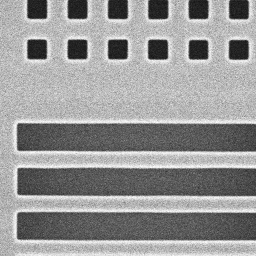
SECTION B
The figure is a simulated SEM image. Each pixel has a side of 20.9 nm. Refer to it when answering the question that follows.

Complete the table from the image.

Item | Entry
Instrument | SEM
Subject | groups of lines, slits or small figures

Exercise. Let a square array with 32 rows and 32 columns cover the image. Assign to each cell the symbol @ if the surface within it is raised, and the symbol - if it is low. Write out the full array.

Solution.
@@@---@@---@@---@@---@@@--@@@--@
@@@---@@---@@---@@---@@@--@@@--@
@@@@@@@@@@@@@@@@@@@@@@@@@@@@@@@@
@@@@@@@@@@@@@@@@@@@@@@@@@@@@@@@@
@@@@@@@@@@@@@@@@@@@@@@@@@@@@@@@@
@@@---@@---@@---@@---@@@--@@@--@
@@@---@@---@@---@@---@@@--@@---@
@@@@-@@@@-@@@@-@@@@--@@@--@@@--@
@@@@@@@@@@@@@@@@@@@@@@@@@@@@@@@@
@@@@@@@@@@@@@@@@@@@@@@@@@@@@@@@@
@@@@@@@@@@@@@@@@@@@@@@@@@@@@@@@@
@@@@@@@@@@@@@@@@@@@@@@@@@@@@@@@@
@@@@@@@@@@@@@@@@@@@@@@@@@@@@@@@@
@@@@@@@@@@@@@@@@@@@@@@@@@@@@@@@@
@@@@@@@@@@@@@@@@@@@@@@@@@@@@@@@@
@@------------------------------
@@------------------------------
@@------------------------------
@@------------------------------
@@@@@@@@@@@@@@@@@@@@@@@@@@@@@@@@
@@@@@@@@@@@@@@@@@@@@@@@@@@@@@@@@
@@------------------------------
@@------------------------------
@@------------------------------
@@@@@@@@@-----------------------
@@@@@@@@@@@@@@@@@@@@@@@@@@@@@@@@
@@@----------------@@@@@@@@@@@@@
@@------------------------------
@@------------------------------
@@------------------------------
@@@@@@@@@@@@@@@@@@@@@@@@@@@@@@@@
@@@@@@@@@@@@@@@@@@@@@@@@@@@@@@@@